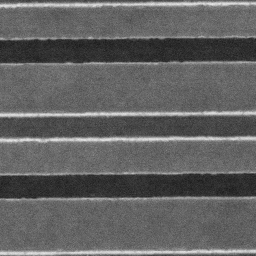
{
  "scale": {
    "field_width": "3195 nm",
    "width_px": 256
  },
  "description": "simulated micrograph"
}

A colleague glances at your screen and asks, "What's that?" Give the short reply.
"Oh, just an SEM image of lines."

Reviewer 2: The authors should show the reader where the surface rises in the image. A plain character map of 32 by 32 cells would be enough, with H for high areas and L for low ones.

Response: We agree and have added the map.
LLLLLLLLLLLLLLLLLLHHLHHHHHHHHHHH
HHHHHHHHHHHHHHHHHHHHHHHHHHHHHHHH
HHHHHHHHHHHHHHHHHHHHHHHHHHHHHHHH
HHHHHHHHHHHHHHHHHHHHHHHHHHHHHHHH
HHHHHHHHHHHHHHHHHHHHHHHHHHHHHHHH
LLLLLLLLLLLLLLLLLLLLLLLLLLLLLLLL
LLLLLLLLLLLLLLLLLLLLLLLLLLLLLLLL
LLLLLLLLLLLLLLLLLLLLLLLLLLLLLLLL
HHHHHHHHHHHHHHHHHHHHHHHHHHHHHHHH
HHHHHHHHHHHHHHHHHHHHHHHHHHHHHHHH
HHHHHHHHHHHHHHHHHHHHHHHHHHHHHHHH
HHHHHHHHHHHHHHHHHHHHHHHHHHHHHHHH
HHHHHHHHHHHHHHHHHHHHHHHHHHHHHHHH
HHHHHHHHHHHHHHHHHHHHHHHHHHHHHHHH
LLLLLLLLLLLLLLLLLLLLLLLLLLLLLLLL
LLLLLLLLLLLLLLLLLLLLLLLLLLLLLLLL
LLLLLLLLLLLLLLLLLLLLLLLLLLLLLLLL
LLLLLLLLLLLLHHHHHHHHHHHHHHHHHHHH
HHHHHHHHHHHHHHHHHHHHHHHHHHHHHHHH
HHHHHHHHHHHHHHHHHHHHHHHHHHHHHHHH
HHHHHHHHHHHHHHHHHHHHHHHHHHHHHHHH
HHHHHHHHHHHHHHHHHHHHHHHHHHHHHHHH
LLLLLLLLLLLLLLLLLLLLLLLLLLLLLLLL
LLLLLLLLLLLLLLLLLLLLLLLLLLLLLLLL
LLLLLLLLLLLLLLLLLLLLLLLLLLLLLLLL
HHHHHHHHHHHHHHHHHHHHHHHHHHHHHHHH
HHHHHHHHHHHHHHHHHHHHHHHHHHHHHHHH
HHHHHHHHHHHHHHHHHHHHHHHHHHHHHHHH
HHHHHHHHHHHHHHHHHHHHHHHHHHHHHHHH
HHHHHHHHHHHHHHHHHHHHHHHHHHHHHHHH
HHHHHHHHHHHHHHHHHHHHHHHHHHHHHHHH
HHHHHHHHHHHHHHHHHHHLLLLLLLLLLLLL